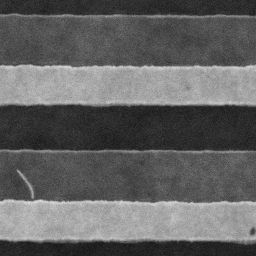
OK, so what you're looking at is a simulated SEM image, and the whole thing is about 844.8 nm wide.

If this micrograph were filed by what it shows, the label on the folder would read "lines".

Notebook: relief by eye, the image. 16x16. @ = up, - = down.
----------------
@@@@@@@@@@@@@@@@
@@@@@@@@@@@@@@@@
@@@@@@@@@@@@@@@@
@@@@@@@@@@@@@@@@
@@@@@@@@@@@@@@@@
@@@@-@@@@@@@@@@@
----------------
----------------
@@@@@@@@@@@@@@@@
@@@@@@@@@@@@@@@@
@@@@@@@@@@@@@@@@
@@@@@@@@@@@@@@@@
@@@@@@@@@@@@@@@@
@@@@@@@@@@@@@@@@
----------------